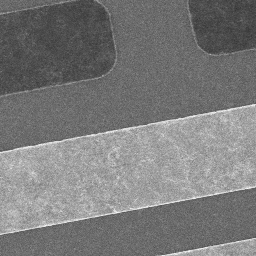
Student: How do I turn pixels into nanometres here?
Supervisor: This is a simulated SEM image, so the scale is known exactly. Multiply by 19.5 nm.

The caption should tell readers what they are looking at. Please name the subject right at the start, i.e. one or a few lines or trenches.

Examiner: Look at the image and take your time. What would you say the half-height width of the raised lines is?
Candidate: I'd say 1580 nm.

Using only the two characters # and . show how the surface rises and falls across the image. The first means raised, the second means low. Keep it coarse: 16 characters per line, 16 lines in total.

..#####.....####
#######.....####
#######.....####
#######.........
#######.........
###.............
................
...........#####
.....###########
################
################
################
############....
######..........
#...............
.............###